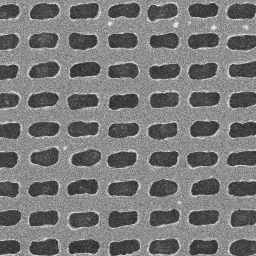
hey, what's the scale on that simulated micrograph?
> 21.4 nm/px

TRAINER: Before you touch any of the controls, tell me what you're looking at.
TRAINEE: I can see a regular array of holes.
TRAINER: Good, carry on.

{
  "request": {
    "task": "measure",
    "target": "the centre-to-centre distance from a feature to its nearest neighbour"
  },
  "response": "0.62 microns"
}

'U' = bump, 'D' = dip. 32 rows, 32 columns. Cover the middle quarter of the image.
UUDDDDDDDUUUDDDDDDUUUUDDDDDDDUUD
UDDDDDDDDUUDDDDDDDDUUDDDDDDDDUUD
UDDDDDDDDUUDDDDDDDDUUDDDDDDDDUUD
UUUUUUUUUUUUDDDUUDUUUUDDDDDUUUUU
UUUUUUUUUUUUUUUUUUUUUUUUUUUUUUUU
UUUUUUUUUUUUUUUUUUUUUUUUUUUUUUUU
UUUUUUUUUUUUUUUUUUUUUUUUUUUUUUUU
UUUDDUDDUUUUUUUDDDUUUUDDDDDDUUUU
UDDDDDDDDUUUDDDDDDDUUDDDDDDDDUUD
UDDDDDDDDUUDDDDDDDDUUUDDDDDDDUUD
UDDDDDDDUUUDDDDDDDUUUUDDDDDDUUUU
UUUUUUUUUUUUUUUUUUUUUUUUUUUUUUUU
UUUUUUUUUUUUUUUUUUUUUUUUUUUUUUUU
UUUUUUUUUUUUUUUUUUUUUUUUUUUUUUUU
UUDDDUDDUUUUUUUUUUUUUUUUUUUUUUUU
UDDDDDDDDUUUDDDDDDDUUUDDDDDDUUUU
UDDDDDDDDUUDDDDDDDDUUDDDDDDDUUUD
UDDDDDDDUUUDDDDDDDUUUDDDDDDDUUUU
UUUUUUUUUUUUDDDUUUUUUUDDDDUUUUUU
UUUUUUUUUUUUUUUUUUUUUUUUUUUUUUUU
UUUUUUUUUUUUUUUUUUUUUUUUUUUUUUUU
UUUUUDDDDUUUUUUUUUUUUUUUUUUUUUUU
UUUDDDDDDUUUDDDDDDUUUUDDDDDDDUUD
UUDDDDDDDUUDDDDDDDUUUDDDDDDDUUDD
UUDDDDDDUUUDDDDDDDUUUDDDDDDDUUUD
UUUDDDDUUUUDDDDDDUUUUUDDDDDUUUUD
UUUUUUUUUUUUUUUUUUUUUUUUUUUUUUUU
UUUUUUUUUUUUUUUUUUUUUUUUUUUUUUUU
UUUUUUUUUUUUUUUUUUUUUUUUUUUUUUUU
UUDDDDDDUUUUDDDDDDUUUUDDDDDDUUUU
UDDDDDDDDUUDDDDDDDDUUUDDDDDDUUUU
UDDDDDDDUUUDDDDDDDUUUDDDDDDDUUUU